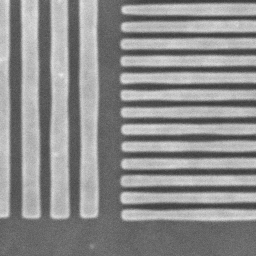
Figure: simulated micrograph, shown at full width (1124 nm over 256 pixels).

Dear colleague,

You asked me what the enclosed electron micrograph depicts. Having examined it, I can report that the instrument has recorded groups of lines, slits or small figures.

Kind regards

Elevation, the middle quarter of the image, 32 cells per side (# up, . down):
#...####........................
#...####........................
#...####.......#################
#...####......##################
#...####.......####...##########
#...####........................
#...####........................
#...####......##################
#...####......##################
#...####........................
#...####........................
#...####......##################
#...####......##################
#...####........................
#...####........................
#...####.......#################
#...####.......#################
#...####........................
#...####........................
#...####........................
#...####.......#################
#...####.......#################
#...####........................
#...####........................
#...####.......#################
#...####.......#################
#...####........................
#...####........................
#...####......##################
#...####......##################
#...####.......#######..........
#...####........................